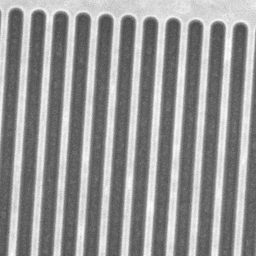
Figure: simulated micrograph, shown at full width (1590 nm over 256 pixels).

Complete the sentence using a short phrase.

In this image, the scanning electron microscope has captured parallel lines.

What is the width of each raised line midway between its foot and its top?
58.1 nm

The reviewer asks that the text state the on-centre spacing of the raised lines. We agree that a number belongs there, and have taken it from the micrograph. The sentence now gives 0.14 µm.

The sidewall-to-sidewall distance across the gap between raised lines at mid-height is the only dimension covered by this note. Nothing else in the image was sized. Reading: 84.4 nanometres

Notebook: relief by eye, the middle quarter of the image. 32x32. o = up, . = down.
oo....oo....oo...oo....oo....o..
oo....oo...ooo...oo....oo...oo..
oo....oo...oo....oo....oo...oo..
oo....oo...oo....oo....oo...oo..
oo....oo...oo....oo....oo...oo..
oo....oo...oo....oo...ooo...oo..
oo...ooo...oo....oo...ooo...oo..
oo...ooo...oo....oo...oo....oo..
oo...ooo...oo....oo...oo....oo..
oo...oo....oo....oo...oo....oo..
oo...oo....oo....oo...oo....oo..
oo...oo....oo...oo....oo....oo..
o....oo....oo...oo....oo....oo..
o....oo....oo...oo....oo....oo..
o....oo....oo...oo....oo....oo..
o....oo....oo...oo....oo....oo..
o....oo....oo...oo....oo....o...
o....oo....o....oo....oo...oo...
o....oo...oo....oo....oo...oo...
o....oo...oo....oo....oo...oo...
o....oo...oo....oo...ooo...oo...
o....oo...oo....oo...ooo...oo...
o...ooo...oo....oo...oo....oo...
o...ooo...oo....oo...oo....oo...
o...oo....oo....oo...oo....oo...
o...oo....oo....oo...oo....oo...
o...oo....oo....o....oo....oo...
o...oo....oo...oo....oo....oo...
....oo....oo...oo....oo....oo...
....oo....oo...oo....oo....oo...
....oo....oo...oo....oo....oo...
....oo...ooo...oo....oo....o....